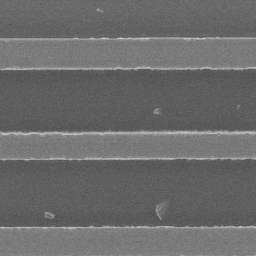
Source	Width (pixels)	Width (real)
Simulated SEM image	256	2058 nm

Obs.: lines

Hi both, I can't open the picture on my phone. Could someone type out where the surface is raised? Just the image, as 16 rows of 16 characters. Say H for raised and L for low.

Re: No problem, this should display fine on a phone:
LLLLLLLLLLLLLLLL
LLLLLLLLLLLLLLLL
HHHHHHHHHHHHHHHH
HHHHHHHHHHHHHHHH
LLLLLLLLLLLLLLLL
LLLLLLLLLLLLLLLL
LLLLLLLLLLLLLLLL
LLLLLLLLLLLLLLLL
HHHHHHHHHHHHHHHH
HHHHHHHHHHHHHHHH
LLLLLLLLLLLLLLLL
LLLLLLLLLLLLLLLL
LLLLLLLLLLLLLLLL
LLLLLLLLLLLLLLLL
HHHHHHHHHHHHHHHH
HHHHHHHHHHHHHHHH